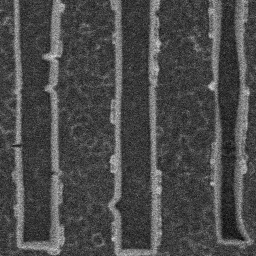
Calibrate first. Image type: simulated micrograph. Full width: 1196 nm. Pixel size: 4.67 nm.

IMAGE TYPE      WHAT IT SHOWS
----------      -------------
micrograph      one or a few lines or trenches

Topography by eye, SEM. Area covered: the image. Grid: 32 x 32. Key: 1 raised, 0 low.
11000001111111100001111111100011
11000001111111100001111111100011
11000001111111100001111111100011
11000001111111100001111111100011
11000001111111100001111111100011
11000001111111100001111111100011
11000001111111100001111111100011
11000011111111100001111111100011
11000001111111100001111111100011
11000001111111100001111111100011
11000011111111100001111111100011
11000011111111100001111111100011
11000001111111100001111111100011
11000001111111100001111111100011
11000001111111100001111111100011
11000001111111100001111111100011
11000001111111100001111111100011
11000001111111100001111111100011
11000001111111100001111111100011
11000001111111100001111111100011
11000001111111100001111111100011
11000001111111100001111111100011
11000001111111100001111111100011
11100001111111100001111111100011
11100001111111100001111111100011
11100001111111000001111111100011
11100001111111000001111111100011
11100001111111100001111111100011
11000001111111100001111111100011
11000001111111100001111111100001
11100001111111100001111111111111
11111111111111100001111111111111